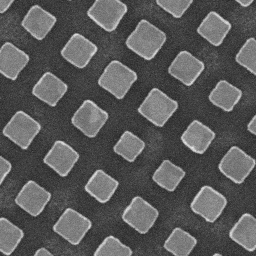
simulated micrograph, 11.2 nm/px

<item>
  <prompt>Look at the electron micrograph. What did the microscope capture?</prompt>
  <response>a regular array of raised bodies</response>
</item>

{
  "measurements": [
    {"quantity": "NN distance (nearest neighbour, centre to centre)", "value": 48.3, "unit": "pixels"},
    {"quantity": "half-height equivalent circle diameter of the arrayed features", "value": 30.9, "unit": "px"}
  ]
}